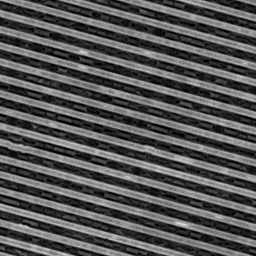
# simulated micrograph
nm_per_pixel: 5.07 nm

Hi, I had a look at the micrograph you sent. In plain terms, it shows parallel lines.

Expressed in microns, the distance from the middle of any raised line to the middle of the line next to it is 0.0789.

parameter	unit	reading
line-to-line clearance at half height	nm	45.3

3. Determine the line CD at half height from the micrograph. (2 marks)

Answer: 6.27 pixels